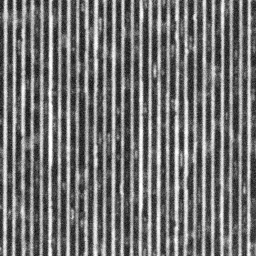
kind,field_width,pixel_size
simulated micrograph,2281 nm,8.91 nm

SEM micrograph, parallel lines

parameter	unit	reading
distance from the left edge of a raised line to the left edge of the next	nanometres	80.4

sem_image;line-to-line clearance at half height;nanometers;60.1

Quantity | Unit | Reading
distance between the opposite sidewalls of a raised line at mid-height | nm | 22.3